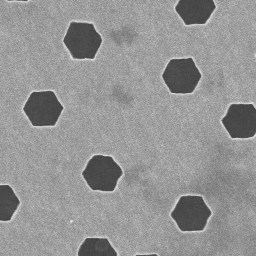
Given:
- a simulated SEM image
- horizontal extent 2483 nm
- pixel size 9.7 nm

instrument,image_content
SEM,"holes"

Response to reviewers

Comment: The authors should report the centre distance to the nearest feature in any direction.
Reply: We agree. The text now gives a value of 0.851 microns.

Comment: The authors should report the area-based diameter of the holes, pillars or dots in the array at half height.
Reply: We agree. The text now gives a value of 354 nanometers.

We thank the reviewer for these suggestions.